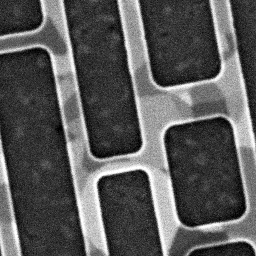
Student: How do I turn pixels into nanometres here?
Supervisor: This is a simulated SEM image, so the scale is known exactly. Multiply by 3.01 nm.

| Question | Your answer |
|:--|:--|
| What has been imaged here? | one or a few lines or trenches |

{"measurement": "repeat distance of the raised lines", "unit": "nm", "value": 242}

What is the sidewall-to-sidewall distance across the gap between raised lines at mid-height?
0.195 microns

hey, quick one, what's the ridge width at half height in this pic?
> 58.1 nanometers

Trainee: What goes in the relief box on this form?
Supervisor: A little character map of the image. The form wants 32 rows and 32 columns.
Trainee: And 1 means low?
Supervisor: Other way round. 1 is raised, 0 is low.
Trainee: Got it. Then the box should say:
00000111000000011000000000111000
00000111000000011100000000011000
00000111000000011100000000011000
00000111000000011100000000011000
11111111100000001100000000011000
11111111100000001100000000011000
10000011100000001100000000011100
00000011100000001110000000001100
00000001100000001110000000001100
00000001100000000110000000011100
00000001110000000110000111111100
00000001110000000111111111111110
00000001110000000111111111111110
00000000110000000111111111111110
00000000110000000111111111111110
00000000110000000011110000000110
00000000111000000011100000000111
00000000111000000011000000000111
00000000011000000011100000000011
00000000011100011111100000000011
10000000011111111111100000000011
10000000011111100011100000000011
10000000011100000001100000000011
10000000011100000001100000000001
10000000001100000001110000000001
10000000001100000001110000000001
11000000001100000000110000000001
11000000001110000000110000000011
11000000001110000000111111111111
11000000000110000000111111111111
11000000000110000000111111110001
11000000000110000000111100000000